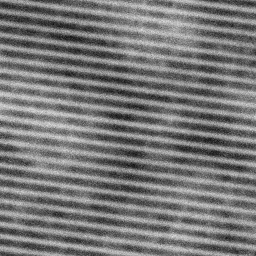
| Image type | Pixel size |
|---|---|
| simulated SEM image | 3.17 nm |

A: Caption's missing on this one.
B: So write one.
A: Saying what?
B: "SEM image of parallel lines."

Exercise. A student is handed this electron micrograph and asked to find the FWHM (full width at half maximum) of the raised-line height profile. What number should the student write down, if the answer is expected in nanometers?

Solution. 10.6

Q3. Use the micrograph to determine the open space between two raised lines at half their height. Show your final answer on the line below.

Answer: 26.3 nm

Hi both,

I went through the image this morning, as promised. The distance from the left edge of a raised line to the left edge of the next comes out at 37.3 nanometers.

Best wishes